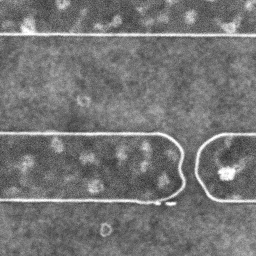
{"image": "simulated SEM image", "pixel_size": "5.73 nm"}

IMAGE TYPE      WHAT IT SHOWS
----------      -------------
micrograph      one or a few lines or trenches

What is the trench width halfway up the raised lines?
563 nm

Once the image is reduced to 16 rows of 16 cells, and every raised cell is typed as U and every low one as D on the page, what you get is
UUUUUUUUUUUUUUUU
UUUUUUUUUUUUUUUU
DDDDDDDDDDDDDDDD
DDDDDDDDDDDDDDDD
DDDDDDDDDDDDDDDD
DDDDDDDDDDDDDDDD
DDDDDDDDDDDDDDDD
DDDDDDDDDDDDDDDD
UUUUUUUUUUDDDDUU
UUUUUUUUUUUDUUUU
UUUUUUUUUUUDUUUU
UUUUUUUUUUUDDUUU
UUUUUUUUUUDDDDUU
DDDDDDDDDDDDDDDD
DDDDDDDDDDDDDDDD
DDDDDDDDDDDDDDDD